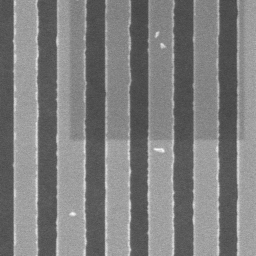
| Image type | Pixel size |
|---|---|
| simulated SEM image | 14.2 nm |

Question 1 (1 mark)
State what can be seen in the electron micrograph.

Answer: lines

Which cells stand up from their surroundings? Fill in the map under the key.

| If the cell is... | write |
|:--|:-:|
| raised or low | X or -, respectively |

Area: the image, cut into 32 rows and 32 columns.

--XXX--XXXX--XXX---XXX--XXX---XX
--XXX--XXXX--XXX---XXX--XXX---XX
--XXX--XXXX--XXX---XXX--XXX---XX
--XXX--XXXX--XXX---XXX--XXX---XX
--XXX--XXXX--XXX---XXX--XXX---XX
--XXX--XXXX--XXX---XXX--XXX---XX
--XXX--XXXX--XXX---XXX--XXX---XX
--XXX--XXXX--XXX---XXX--XXX---XX
--XXX--XXXX--XXX---XXX--XXX---XX
--XXX--XXXX--XXX---XXX--XXX---XX
--XXX--XXXX--XXX---XXX--XXX---XX
--XXX--XXXX--XXX---XXX--XXX---XX
--XXX--XXXX--XXX---XXX--XXX---XX
--XXX--XXXX--XXX---XXX--XXX---XX
--XXX--XXXX--XXX---XXX--XXX---XX
--XXX--XXXX--XXX---XXX--XXX---XX
--XXX--XXXX--XXX---XXX--XXX---XX
--XXX--XXXX--XXX---XXX--XXX---XX
--XXX--XXXX--XXX---XXX--XXX---XX
--XXX--XXXX--XXX---XXX--XXX---XX
--XXX--XXXX--XXX---XXX--XXX---XX
--XXX--XXXX--XXX---XXX--XXX---XX
--XXX--XXXX--XXX---XXX--XXX---XX
--XXX--XXXX--XXX---XXX--XXX---XX
--XXX--XXXX--XXX---XXX--XXX---XX
--XXX--XXXX--XXX---XXX--XXX---XX
--XXX--XXXX--XXX---XXX--XXX---XX
--XXX--XXXX--XXX---XXX--XXX---XX
--XXX--XXXX--XXX---XXX--XXX---XX
--XXX--XXXX--XXX---XXX--XXX---XX
--XXX--XXXX--XXX---XXX--XXX---XX
--XXX--XXXX--XXX---XXX--XXX---XX